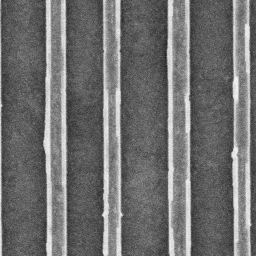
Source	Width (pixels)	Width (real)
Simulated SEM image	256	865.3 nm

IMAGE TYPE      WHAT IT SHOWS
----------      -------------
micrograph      one or a few lines or trenches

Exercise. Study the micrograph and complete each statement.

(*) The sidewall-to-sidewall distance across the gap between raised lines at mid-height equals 152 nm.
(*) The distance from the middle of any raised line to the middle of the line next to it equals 210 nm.